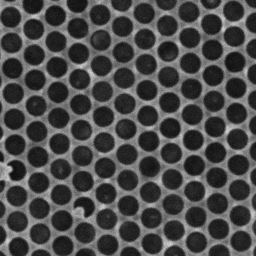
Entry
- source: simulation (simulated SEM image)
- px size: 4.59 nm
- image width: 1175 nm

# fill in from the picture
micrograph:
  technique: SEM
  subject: a regular array of holes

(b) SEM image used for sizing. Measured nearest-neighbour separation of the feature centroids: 116 nm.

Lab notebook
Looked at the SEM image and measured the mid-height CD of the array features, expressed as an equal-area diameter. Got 100 nm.